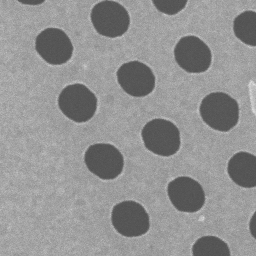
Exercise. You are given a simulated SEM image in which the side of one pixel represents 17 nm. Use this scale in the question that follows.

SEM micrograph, a regular array of holes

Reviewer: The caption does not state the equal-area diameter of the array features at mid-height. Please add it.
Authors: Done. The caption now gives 646 nm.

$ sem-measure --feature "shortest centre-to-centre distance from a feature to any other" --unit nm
1050